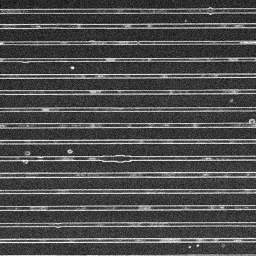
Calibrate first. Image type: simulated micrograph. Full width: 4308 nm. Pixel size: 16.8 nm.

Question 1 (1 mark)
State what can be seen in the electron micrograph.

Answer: parallel lines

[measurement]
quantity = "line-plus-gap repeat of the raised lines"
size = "276 nanometres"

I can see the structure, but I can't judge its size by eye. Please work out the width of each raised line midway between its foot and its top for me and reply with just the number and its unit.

65.2 nanometres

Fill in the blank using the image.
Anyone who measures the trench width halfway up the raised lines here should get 12.4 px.